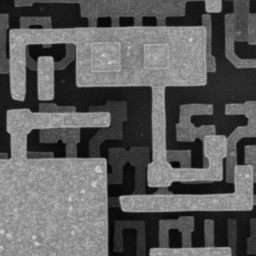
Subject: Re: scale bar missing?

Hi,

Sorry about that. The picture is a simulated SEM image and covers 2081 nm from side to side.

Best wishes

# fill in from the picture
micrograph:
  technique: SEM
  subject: wiring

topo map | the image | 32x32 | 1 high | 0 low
00000000000000000000000000110110
00000000000000000000000000000110
00000000000000000000000000000110
00000000011111111111111111000110
01111111111111111111111111000110
01110000011111111111111111000000
01100000001111111111111111000000
01100110001111111111111111000000
01100110001111111111111111000000
01100110001111111111111111000000
01100110001111111111111111000000
01100110000000000001100000000000
00100000000000000001100000000000
00000000000000000001100000000000
01111111111111000001100000000000
01111111111111000001100000000000
01110000000000000001100000000000
01100000000000000001100000110000
01100000000000000001100000110000
01100000000000000001100000110000
11111111111110000001100000110000
11111111111110000011111111110111
11111111111110000011111111110111
11111111111110000000000000000111
11111111111110001111111111111111
11111111111110011111111111111111
11111111111110000100000000000000
11111111111110000000000000000000
11111111111110000000000000000000
11111111111110000000000000000000
11111111111110000000000000000000
11111111111110000001111111111000